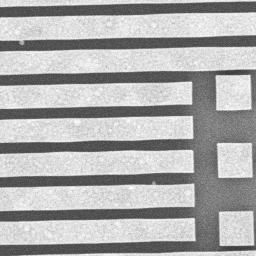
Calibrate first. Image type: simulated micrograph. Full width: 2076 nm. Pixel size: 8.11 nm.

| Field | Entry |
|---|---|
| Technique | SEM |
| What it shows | groups of lines, slits or small figures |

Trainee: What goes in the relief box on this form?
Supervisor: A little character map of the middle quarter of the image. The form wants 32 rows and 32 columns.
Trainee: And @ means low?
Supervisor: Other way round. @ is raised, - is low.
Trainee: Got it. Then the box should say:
@@@@@@@@@@@@@@@@@@@@@@@@@@@@@@@@
@@@@@@@@@@@@@@@@@@@@@@@@@@@@@@@@
--------------------------------
--------------------------------
--------------------------------
@@@@@@@@@@@@@@@@@@@@@@@@@@@@@@@@
@@@@@@@@@@@@@@@@@@@@@@@@@@@@@@@@
@@@@@@@@@@@@@@@@@@@@@@@@@@@@@@@@
@@@@@@@@@@@@@@@@@@@@@@@@@@@@@@@@
@@@@@@@@@@@@@@@@@@@@@@@@@@@@@@@@
@@@@@@--------------------------
--------------------------------
--------------------------------
-------------@@@@@@@@@@@@@@@@@@@
@@@@@@@@@@@@@@@@@@@@@@@@@@@@@@@@
@@@@@@@@@@@@@@@@@@@@@@@@@@@@@@@@
@@@@@@@@@@@@@@@@@@@@@@@@@@@@@@@@
@@@@@@@@@@@@@@@@@@@@@@@@@@@@@@@@
@@@@@@@@@@@@@@@@@@@@@@@@@@@@@@@@
--------------------------------
--------------------------------
--------------------------------
@@@@@@@@@@@@@@@@@@@@@@@@@@@@@@@@
@@@@@@@@@@@@@@@@@@@@@@@@@@@@@@@@
@@@@@@@@@@@@@@@@@@@@@@@@@@@@@@@@
@@@@@@@@@@@@@@@@@@@@@@@@@@@@@@@@
@@@@@@@@@@@@@@@@@@@@@@@@@@@@@@@@
@@@@@@@@@@@@@@@@@@@-------------
--------------------------------
--------------------------------
----------@@@@@@@@@@@@@@@@@@@@@@
@@@@@@@@@@@@@@@@@@@@@@@@@@@@@@@@